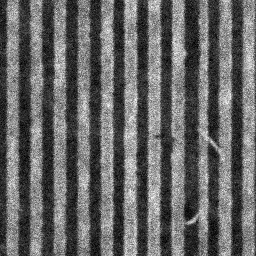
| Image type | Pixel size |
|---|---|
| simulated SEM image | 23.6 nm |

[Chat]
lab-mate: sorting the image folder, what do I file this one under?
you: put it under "parallel lines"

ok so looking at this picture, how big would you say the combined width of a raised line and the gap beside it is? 558 nm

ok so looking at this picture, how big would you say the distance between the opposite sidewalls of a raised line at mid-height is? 322 nm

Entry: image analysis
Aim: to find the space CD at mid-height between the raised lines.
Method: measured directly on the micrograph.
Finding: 0.222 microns